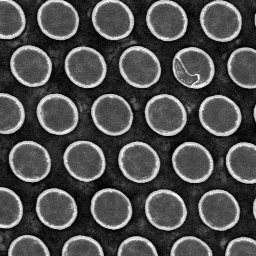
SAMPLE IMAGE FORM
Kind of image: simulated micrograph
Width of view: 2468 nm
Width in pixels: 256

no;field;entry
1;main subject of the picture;a regular array of raised bodies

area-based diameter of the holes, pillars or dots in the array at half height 377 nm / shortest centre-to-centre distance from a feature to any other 0.52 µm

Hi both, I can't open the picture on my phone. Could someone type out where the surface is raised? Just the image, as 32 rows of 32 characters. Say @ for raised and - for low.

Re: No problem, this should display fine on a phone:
@@----@@@---@@@----@@@----@@@---
@@@--@@@@---@@@@---@@@@--@@@@@--
@@@--@@@@@--@@@@@--@@@@--@@@@@--
@@@--@@@@---@@@@---@@@@--@@@@@--
@@----@@@----@@@----@@----@@@---
--------------------------------
--@@@----@@@----@@@----@@----@@@
-@@@@@--@@@@@--@@@@@--@@@@---@@@
-@@@@@--@@@@@--@@@@@---@@@@--@@@
--@@@@---@@@@--@@@@@----@@---@@@
---@@-----@@----@@@-----@@----@@
--------------------------------
@@---@@@@---@@@----@@@----@@@---
@@@--@@@@---@@@@--@@@@@--@@@@@--
@@@--@@@@@--@@@@--@@@@@--@@@@@--
@@@--@@@@---@@@@---@@@@--@@@@@--
@-----@@-----@@-----@@-----@@---
--------------------------------
--@@@----@@@----@@@---@@@----@@@
-@@@@@--@@@@@--@@@@@--@@@@--@@@@
-@@@@@--@@@@@--@@@@@--@@@@@-@@@@
--@@@@---@@@@--@@@@@--@@@@---@@@
---@@------------@-----@@-----@@
--------------------------------
@@---@@@@---@@@@---@@@----@@@---
@@@--@@@@---@@@@--@@@@@--@@@@@--
@@@--@@@@---@@@@--@@@@@--@@@@@--
@@---@@@@---@@@@---@@@@--@@@@@--
--------------@-----@@-----@----
--------------------------------
--@@@---@@@@---@@@@---@@@@---@@@
-@@@@@--@@@@@--@@@@---@@@@--@@@@